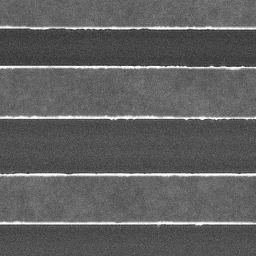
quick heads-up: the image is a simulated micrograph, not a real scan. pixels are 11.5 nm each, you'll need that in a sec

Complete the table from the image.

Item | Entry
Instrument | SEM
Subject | lines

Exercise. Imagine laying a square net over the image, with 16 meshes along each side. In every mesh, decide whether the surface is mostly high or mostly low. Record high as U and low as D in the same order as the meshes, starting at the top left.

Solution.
UUUUUUUUUUUUUUUU
UUUUUUUUUUUUUUUU
DDDDDDDDDDDDDDDD
DDDDDDDDDDDDDDDD
UUUUUUUUUUUUUUUU
UUUUUUUUUUUUUUUU
UUUUUUUUUUUUUUUU
DDDDDDDDDDDDDDDD
DDDDDDDDDDDDDDDD
DDDDDDDDDDDDDDDD
DDDDDDDDDDDDDDDD
UUUUUUUUUUUUUUUU
UUUUUUUUUUUUUUUU
UUUUUUUUUUUUUUUU
DDDDDDDDDDDDDDDD
DDDDDDDDDDDDDDDD